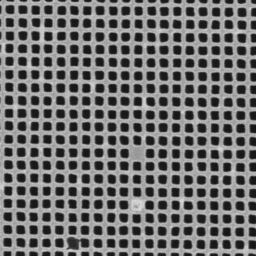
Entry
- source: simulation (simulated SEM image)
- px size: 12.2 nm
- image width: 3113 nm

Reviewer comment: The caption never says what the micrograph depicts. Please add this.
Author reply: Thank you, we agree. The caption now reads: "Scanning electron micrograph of a regular array of holes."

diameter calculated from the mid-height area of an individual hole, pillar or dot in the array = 119 nm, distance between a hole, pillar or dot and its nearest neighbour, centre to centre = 0.153 micrometres